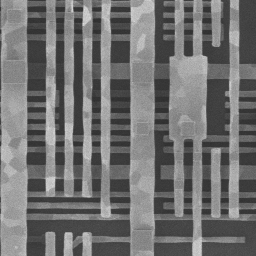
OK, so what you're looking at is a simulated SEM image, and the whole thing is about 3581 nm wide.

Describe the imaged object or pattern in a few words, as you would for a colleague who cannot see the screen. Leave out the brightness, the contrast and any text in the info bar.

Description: wiring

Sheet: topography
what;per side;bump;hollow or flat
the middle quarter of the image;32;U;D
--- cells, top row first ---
UUDDDUUDDUUDDDDDDUUUUUDDDDUUUUUU
UUDDDUUDDUUDDDDDDUUUUUDDDDUUUUUU
UUDDDUUDDUUDDDDDDUUUUUDDDDUUUUUU
UUDDDUUDDUUDDDDDDUUUUUDDDDUUUUUU
UUDDDUUDDUUDDDDDDUUUUUDDDDUUUUUU
UUDDDUUDDUUDDDDDDUUUUUDDDDUUUUUU
UUDDDUUDDUUDDDDDDUUUUUDDDDUUUUUU
UUDDDUUDDUUDDDDDDUUUUUDDDDUUUUUU
UUDDDUUDDUUDDDDDDUUUUUDDDDUUUUUU
UUDDDUUDDUUDDDDDDUUUUUDDDDUUUUUU
UUDDDUUDDUUDDDDDDUUUUUDDDDUUUUUU
UUDDDUUDDUUDDDDDDUUUUUDDDDUUUUUU
UUDDDUUDDUUDDDDDDUUUUUDDDDUUUUUU
UUDDDUUDDUUDDDDDDUUUUUDDDDUUUUUU
UUDDDUUDDUUDDDDDDUUUUUDDDDUUUUUU
UUDDDUUDDUUDDDDDDUUUUUDDDDUUUUUU
UUDDDUUDDUUDDDDDDUUUUUDDDDUUUUUU
UUDDDUUDDUUDDDDDDUUUUUDDDDUUUUUU
UUDDDUUDDUUDDDDDDUUUUUDDDDUUUUUU
UUDDDUUDDUUDDDDDDUUUUUDDDDDUUUDD
UUDDDUUDDUUDDDDDDUUUUUDDDDDDUUDD
UUDDDUUDDUUDDDDDDUUUUUUDDDDDUUDD
UUDDDUUDDUUDDDDDDUUUUUUDDDDDUUDD
UUDDDUUDDUUDDDDDDUUUUUDDDDDDUUDD
UUDDDUUDDUUDDDDDDUUUUUDDDDDDUUDD
UUDDDUUDDUUDDDDDDUUUUUDDDDDDUUDD
UUDDDUUDDUUDDDDDDUUUUUDDDDDDUUDD
UUDDDUUDDUUDDDDDDUUUUUDDDDDDUUDD
UUDDDUUDDUUDDDDDDUUUUUDDDDDDUUDD
UUDDDUUDDUUDDDDDDUUUUUDDDDDDUUDD
UUDDDUUDDUUDDDDDDUUUUUDDDDDDUUDD
UUDDDUUDDUUDDDDDDUUUUUDDDDDDUUDD